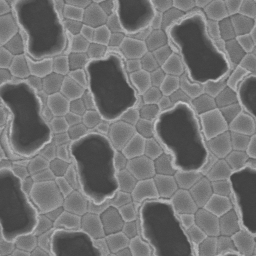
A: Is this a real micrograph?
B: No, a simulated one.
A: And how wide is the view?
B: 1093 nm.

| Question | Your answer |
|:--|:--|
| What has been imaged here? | holes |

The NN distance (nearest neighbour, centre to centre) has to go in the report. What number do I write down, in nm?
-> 356